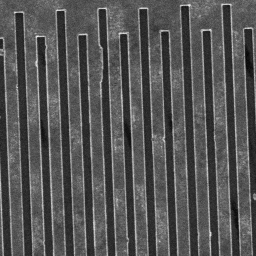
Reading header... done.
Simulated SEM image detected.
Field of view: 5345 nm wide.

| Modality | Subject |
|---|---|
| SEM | parallel lines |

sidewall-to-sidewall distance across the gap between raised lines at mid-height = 8.24 pixels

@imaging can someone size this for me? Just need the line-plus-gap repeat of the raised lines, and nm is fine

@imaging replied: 433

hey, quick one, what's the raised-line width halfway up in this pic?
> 250 nm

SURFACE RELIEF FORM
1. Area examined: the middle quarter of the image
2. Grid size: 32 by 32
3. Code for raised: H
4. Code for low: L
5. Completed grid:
LHHHLLHHHHLHHHLLHHHLLHHHHLLHHHLL
LHHHLLHHHHLHHHLLHHHLLLHHHLLHHHLL
LHHHLLHHHLLHHHLLLHHLLLHHHLLHHHLL
LHHHLLHHHLLHHHLLLHHLLLHHHLLHHHLL
LHHHLLHHHLLLHHLLLHHLLLHHHLLHHHLL
LHHHLLHHHLLLHHLLLHHLLLHHHLLHHHLL
LHHHLLHHHLLLHHLLLHHLLLHHHLLHHHLL
LHHHLLHHHLLHHHLLLHHLLLHHHLLHHHLL
LHHHLLHHHLLLHHLLLHHHLLHHHLLHHHLL
LHHHLLHHHLLLHHLLLHHHLLHHHLLHHHLL
LHHHLLHHHLLLHHHLLHHHLLHHHLLHHHLL
LHHHLLHHHLLLHHHLLHHHLLHHHLLHHHLL
LHHHLLLHHLLLHHHLLHHHLLHHHLLHHHLL
LHHHLLLHHLLLHHHLLHHHLLHHHLLHHHLL
LHHHLLLHHLLLHHHLLHHHLLHHHLLHHHLL
LHHHLLLHHLLLHHHLLHHHLLHHHLLHHHLL
LHHHLLLHHLLLHHHLLHHHLLHHHLLHHHLL
LHHHLLLHHLLLHHHLLHHHLLHHHLLHHHLL
LHHHLLLHHHLLHHHLLHHHLLHHHLLHHHLL
LHHHHLLHHHLLHHHLLHHHLLHHHLLLHHLL
LLHHHLLHHHLLHHHLLHHHLLHHHLLLHHLL
LLHHHLLHHHLLHHHLLHHHLLHHHLLLHHLL
LLHHHLLHHHLLHHHLLHHHLLHHHLLLHHLL
LLHHHLLHHHLLHHHLLHHHLLHHHLLLHHLL
LLHHHLLHHHLLHHHLLHHHLLHHHLLLHHHL
LLHHHLLHHHLLHHHLLHHHLLHHHLLLHHHL
LLHHHLLHHHLLHHHLLHHHLLLHHHLLHHHL
LLHHHLLHHHLLHHHLLHHHLLLHHHLLHHHL
LLHHHLLHHHLLHHHLLLHHLLLHHHLLHHHL
LLHHHLLHHHLLHHHLLLHHLLLHHHLLHHHL
LLHHHLLHHHLLLHHLLLHHLLLHHHLLHHHL
LLHHHLLHHHLLLHHLLLHHLLLHHHLLHHHL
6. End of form